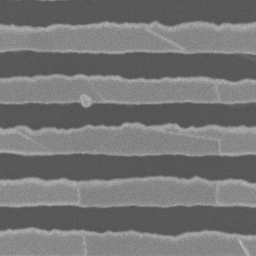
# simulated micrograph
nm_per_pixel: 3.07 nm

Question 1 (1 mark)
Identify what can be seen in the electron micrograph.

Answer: lines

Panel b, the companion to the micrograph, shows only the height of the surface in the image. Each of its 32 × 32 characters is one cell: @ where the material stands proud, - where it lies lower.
--------------------------------
--------------------------------
--------------------------------
@@@@@@@@@@@@@@@@@@@@@@@@@@@@@@@@
@@@@@@@@@@@@@@@@@@@@@@@@@@@@@@@@
@@@@@@@@@@@@@@@@@@@@@@@@@@@@@@@@
------@@@@@@@@@@@-@@@@@@@@@@@@@@
--------------------------------
--------------------------------
-----@@@@@@@@@@-----------------
@@@@@@@@@@@@@@@@@@@@@@@@@@@@@@@@
@@@@@@@@@@@@@@@@@@@@@@@@@@@@@@@@
@@@@@@@@@@@@@@@@@@@@@@@@@@@@@@@@
--------------------------------
--------------------------------
---------------@@@---@----------
@@@@@@@@@@@@@@@@@@@@@@@@@@@@@@@@
@@@@@@@@@@@@@@@@@@@@@@@@@@@@@@@@
@@@@@@@@@@@@@@@@@@@@@@@@@@@@@@@@
--------------------------------
--------------------------------
--------------------------------
@@@@@@@@@--@@@@@@@@@@@@@@@--@@--
@@@@@@@@@@@@@@@@@@@@@@@@@@@@@@@@
@@@@@@@@@@@@@@@@@@@@@@@@@@@@@@@@
@@@@@@@@@@@@@@@@@@@@@@@@@@@@@@@@
--------------------------------
--------------------------------
--------------------------------
@@@@@@@@@@@@@@@@@@@@@@@@@@@@@@@@
@@@@@@@@@@@@@@@@@@@@@@@@@@@@@@@@
@@@@@@@@@@@@@@@@@@@@@@@@@@@@@@@@